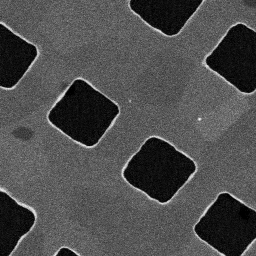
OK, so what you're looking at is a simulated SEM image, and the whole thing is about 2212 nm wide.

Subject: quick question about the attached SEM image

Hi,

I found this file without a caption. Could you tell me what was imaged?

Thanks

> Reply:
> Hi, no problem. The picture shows holes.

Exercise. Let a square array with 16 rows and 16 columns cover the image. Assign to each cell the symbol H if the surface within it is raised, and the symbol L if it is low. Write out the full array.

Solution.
HHHHHHHHLLLLHHHH
HHHHHHHHHLLLHHHH
LLHHHHHHHHHHHHLL
LLHHHHHHHHHHHLLL
LLHHHHHHHHHHHLLL
HHHHLLHHHHHHHHHL
HHHLLLLHHHHHHHHH
HHHLLLLHHHHHHHHH
HHHHLLHHHHHHHHHH
HHHHHHHHHLLHHHHH
HHHHHHHHLLLLHHHH
HHHHHHHHLLLHHHHH
LHHHHHHHHHHHHLLH
LLHHHHHHHHHHHLLL
LLHHHHHHHHHHLLLL
LHHHHHHHHHHHHLLH